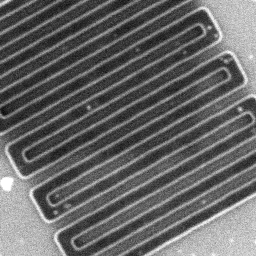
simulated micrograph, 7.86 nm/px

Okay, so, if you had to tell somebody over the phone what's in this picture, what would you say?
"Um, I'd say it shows groups of lines, slits or small figures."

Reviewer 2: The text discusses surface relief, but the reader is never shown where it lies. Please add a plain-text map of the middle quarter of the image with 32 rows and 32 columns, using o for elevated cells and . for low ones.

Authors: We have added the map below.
oo......ooooooo......oooooo.....
......ooooooo......ooooooo......
....oooooooo.....ooooooo.......o
...ooooooo......ooooooo......ooo
.ooooooo......ooooooo......ooooo
oooooo......ooooooo......ooooooo
oooo......ooooooo......ooooooo..
oo......ooooooo......ooooooo....
o......ooooooo......ooooooo.....
.....ooooooo......ooooooo......o
...ooooooo......ooooooo......ooo
.ooooooo......ooooooo......ooooo
oooooo......ooooooo......ooooooo
ooooo......oooooo.......oooooo..
ooo......ooooooo......ooooooo...
o......ooooooo......ooooooo.....
.....ooooooo......ooooooo......o
...ooooooo......ooooooo......ooo
..ooooooo......oooooo......ooooo
ooooooo......ooooooo......oooooo
ooooo......ooooooo......ooooooo.
oooo.....ooooooo......ooooooo...
oo......ooooooo.....ooooooo.....
......ooooooo.....ooooooo......o
....ooooooo......ooooooo.....ooo
..ooooooo......ooooooo......oooo
ooooooo......ooooooo......oooooo
ooooo.......ooooooo.....ooooooo.
oooo......ooooooo......ooooooo..
oo......ooooooo......ooooooo....
......ooooooo......ooooooo......
....ooooooo......ooooooo......oo